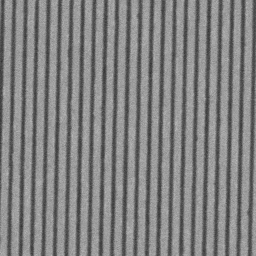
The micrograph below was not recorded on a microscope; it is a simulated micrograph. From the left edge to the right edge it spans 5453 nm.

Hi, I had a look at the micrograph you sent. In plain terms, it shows parallel lines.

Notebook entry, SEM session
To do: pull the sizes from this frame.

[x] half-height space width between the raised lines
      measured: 93.2 nm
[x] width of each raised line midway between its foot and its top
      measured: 0.146 um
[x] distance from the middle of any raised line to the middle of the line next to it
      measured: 244 nanometres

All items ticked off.